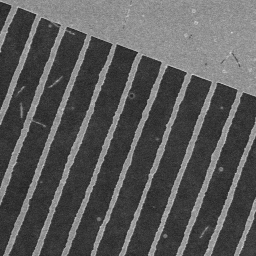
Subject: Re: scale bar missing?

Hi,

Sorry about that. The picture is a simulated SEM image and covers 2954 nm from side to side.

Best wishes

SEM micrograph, parallel lines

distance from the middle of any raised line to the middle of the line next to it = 0.31 um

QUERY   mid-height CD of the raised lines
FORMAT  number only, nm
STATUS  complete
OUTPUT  56.8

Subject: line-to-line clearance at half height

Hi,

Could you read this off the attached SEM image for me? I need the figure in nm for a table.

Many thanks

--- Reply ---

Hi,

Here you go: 251